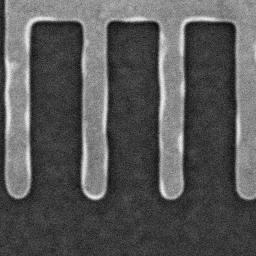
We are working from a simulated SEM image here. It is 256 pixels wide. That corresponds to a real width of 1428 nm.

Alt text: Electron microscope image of groups of lines, slits or small figures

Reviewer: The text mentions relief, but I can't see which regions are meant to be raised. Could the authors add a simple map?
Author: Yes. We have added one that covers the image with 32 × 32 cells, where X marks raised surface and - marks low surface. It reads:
-XXXXXXXXXXXXXXXXXXXXXXXXXXXXXXX
-XXXXXXXXXXXXXXXXXXXXXXXXXXXXXXX
-XXXX-XXXXXXXXXXX-XXXXXX--XXXXXX
-XXX------XXX-------XXX-------XX
-XX--------XX-------XXX-------XX
-XX-------XXX-------XXX-------XX
-XXX------XXX-------XXX-------XX
-XXX------XXX-------XXX-------XX
-XXX------XXX-------XXX-------XX
-XXX------XXX-------XXX-------XX
-XXX------XXX-------XXX-------XX
-XXX------XXX-------XXX-------XX
-XXX------XXX-------XXX-------XX
-XXX------XXX-------XXX-------XX
-XX-------XXX-------XXX-------XX
-XX-------XXX-------XXX-------XX
-XXX------XXX-------XXX-------XX
-XXX------XXX-------XXX-------XX
-XXX-------XX-------XXX-------XX
-XXX-------XX-------XXX-------XX
-XXX------XXX-------XXX-------XX
-XXX------XXX-------XXX-------XX
-XXX------XXX-------XXX-------XX
-XXX------XXX-------XXX-------XX
--X--------XX--------X--------XX
--------------------------------
--------------------------------
--------------------------------
--------------------------------
--------------------------------
--------------------------------
--------------------------------